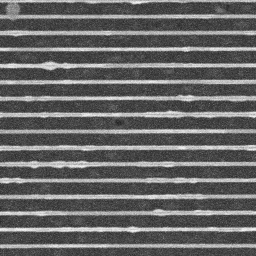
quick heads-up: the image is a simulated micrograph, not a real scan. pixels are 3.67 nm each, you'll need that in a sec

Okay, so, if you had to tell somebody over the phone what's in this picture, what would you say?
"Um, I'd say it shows parallel lines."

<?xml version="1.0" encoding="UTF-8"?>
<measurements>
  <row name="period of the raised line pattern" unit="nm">60.2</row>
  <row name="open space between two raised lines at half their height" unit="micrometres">0.0468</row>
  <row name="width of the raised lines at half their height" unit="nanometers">12.4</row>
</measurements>